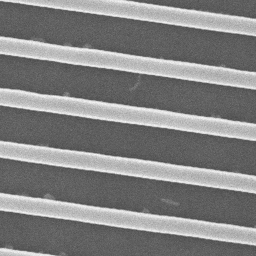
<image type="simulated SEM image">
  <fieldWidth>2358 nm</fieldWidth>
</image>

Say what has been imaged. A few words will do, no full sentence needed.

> lines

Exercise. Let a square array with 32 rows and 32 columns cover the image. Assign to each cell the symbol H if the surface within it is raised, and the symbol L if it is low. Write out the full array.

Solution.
LLLHHHHHHHHHHHHHHHHLLLLLLLLLLLLL
LLLLLLLLLLHHHHHHHHHHHHHHHHLLLLLL
LLLLLLLLLLLLLLLLLHHHHHHHHHHHHHHH
LLLLLLLLLLLLLLLLLLLLLLLLLHHHHHHH
LLLLLLLLLLLLLLLLLLLLLLLLLLLLLLLL
HHHHHHHLLLLLLLLLLLLLLLLLLLLLLLLL
HHHHHHHHHHHHHHLLLLLLLLLLLLLLLLLL
LLLLLLHHHHHHHHHHHHHHHLLLLLLLLLLL
LLLLLLLLLLLLLHHHHHHHHHHHHHHHLLLL
LLLLLLLLLLLLLLLLLLLLHHHHHHHHHHHH
LLLLLLLLLLLLLLLLLLLLLLLLLLLHHHHH
HHHHLLLLLLLLLLLLLLLLLLLLLLLLLLLL
HHHHHHHHHHHLLLLLLLLLLLLLLLLLLLLL
LLLHHHHHHHHHHHHHHHLLLLLLLLLLLLLL
LLLLLLLLLLHHHHHHHHHHHHHHHLLLLLLL
LLLLLLLLLLLLLLLLLHHHHHHHHHHHHHHH
LLLLLLLLLLLLLLLLLLLLLLLLHHHHHHHH
LLLLLLLLLLLLLLLLLLLLLLLLLLLLLLLH
HHHHHHLLLLLLLLLLLLLLLLLLLLLLLLLL
HHHHHHHHHHHHHHLLLLLLLLLLLLLLLLLL
LLLLLLHHHHHHHHHHHHHHHHLLLLLLLLLL
LLLLLLLLLLLLLHHHHHHHHHHHHHHHHLLL
LLLLLLLLLLLLLLLLLLLLHHHHHHHHHHHH
LLLLLLLLLLLLLLLLLLLLLLLLLLLHHHHH
HHHLLLLLLLLLLLLLLLLLLLLLLLLLLLLL
HHHHHHHHHLLLLLLLLLLLLLLLLLLLLLLL
LHHHHHHHHHHHHHHHHLLLLLLLLLLLLLLL
LLLLLLLLLHHHHHHHHHHHHHHHLLLLLLLL
LLLLLLLLLLLLLLLLHHHHHHHHHHHHHHHH
LLLLLLLLLLLLLLLLLLLLLLLLHHHHHHHH
LLLLLLLLLLLLLLLLLLLLLLLLLLLLLLLH
HHHHLLLLLLLLLLLLLLLLLLLLLLLLLLLL